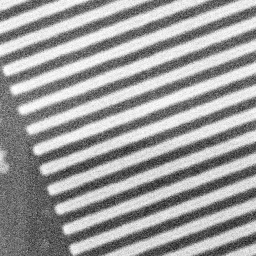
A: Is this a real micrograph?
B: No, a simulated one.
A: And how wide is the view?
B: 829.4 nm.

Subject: groups of lines, slits or small figures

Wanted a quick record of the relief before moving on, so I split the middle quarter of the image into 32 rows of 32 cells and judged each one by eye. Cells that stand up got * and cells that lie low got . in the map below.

..****..........******.........*
****.........******..........***
*..........******.........*****.
........******.........******...
......*****..........*****......
...*****..........*****.........
.*****.........******.........**
***.........******..........****
..........******.........******.
.......******.........*****.....
.....******.........*****.......
..******.........*****..........
*****..........*****..........**
**.........******..........*****
.........******..........*****..
......******.........******.....
....******.........******.......
.******.........******.........*
****..........*****..........***
*..........*****..........*****.
........******.........******...
......*****.........******......
...******.........******........
*****..........******.........**
***..........*****..........****
..........*****..........******.
.......******.........******....
.....*****.........******.......
..******.........******.........
*****..........*****.........***
***.........******.........*****
.........******.........******..